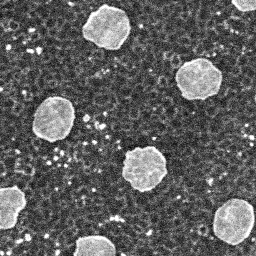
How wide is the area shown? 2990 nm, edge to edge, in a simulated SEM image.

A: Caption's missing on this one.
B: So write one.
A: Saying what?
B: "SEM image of raised bodies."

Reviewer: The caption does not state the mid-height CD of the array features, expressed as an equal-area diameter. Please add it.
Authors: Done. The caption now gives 494 nm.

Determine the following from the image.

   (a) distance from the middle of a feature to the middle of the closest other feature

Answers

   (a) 1210 nm